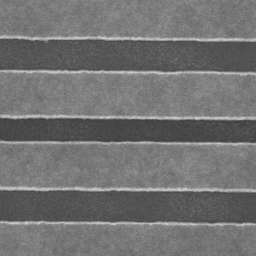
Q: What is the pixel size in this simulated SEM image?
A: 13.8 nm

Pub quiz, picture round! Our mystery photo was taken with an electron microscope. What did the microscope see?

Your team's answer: lines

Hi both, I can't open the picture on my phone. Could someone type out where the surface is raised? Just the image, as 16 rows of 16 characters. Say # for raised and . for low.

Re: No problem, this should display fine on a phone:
################
################
............####
................
##########.#....
################
################
................
................
################
################
################
................
................
################
################